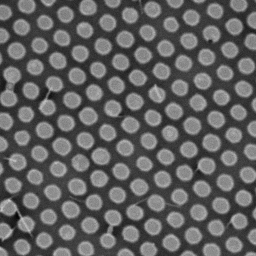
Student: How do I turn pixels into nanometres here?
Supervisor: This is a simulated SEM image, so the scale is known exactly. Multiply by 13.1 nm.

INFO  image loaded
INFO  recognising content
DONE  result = a regular array of raised bodies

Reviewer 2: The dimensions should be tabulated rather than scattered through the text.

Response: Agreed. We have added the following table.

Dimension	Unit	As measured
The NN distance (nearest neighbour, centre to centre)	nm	300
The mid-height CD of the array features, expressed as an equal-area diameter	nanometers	199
